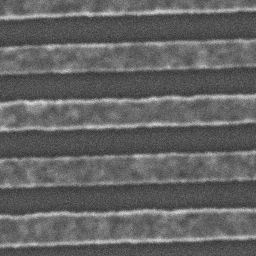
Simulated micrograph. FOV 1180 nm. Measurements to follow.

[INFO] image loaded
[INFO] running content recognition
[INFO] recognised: lines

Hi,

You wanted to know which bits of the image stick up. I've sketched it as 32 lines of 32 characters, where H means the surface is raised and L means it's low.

HHHHHHHHHHHHHHHHHHHHHHHHHHHHHHHH
HHHHHHHHHHHHHHHHHHHHLHLLLLLLLLLL
LLLLLLLLLLLLLLLLLLLLLLLLLLLLLLLL
LLLLLLLLLLLLLLLLLLLLLLLLLLLLLLLL
LLLLLLLLLLLLLLLLLLLLLLLLLLLLLLLL
LLLLLLLLLLLLLLLHHHHHHHHHHHHHHHHH
HHHHHHHHHHHHHHHHHHHHHHHHHHHHHHHH
HHHHHHHHHHHHHHHHHHHHHHHHHHHHHHHH
HHHHHHHHHHHHHHHHHHHHHHHHLLLLLLLL
LLLLLLLLLLLLLLLLLLLLLLLLLLLLLLLL
LLLLLLLLLLLLLLLLLLLLLLLLLLLLLLLL
LLLLLLLLLLLLLLLLLLLLLLLLLLLLLLLL
LLLLLLLLLLLLLHHHHLHHHHHHHHHHHHHH
HHHHHHHHHHHHHHHHHHHHHHHHHHHHHHHH
HHHHHHHHHHHHHHHHHHHHHHHHHHHHHHHH
HHHHHHHHHHHHHHHHHHHHHHHHHHHLLLLL
LLLLLLLLLLLLLLLLLLLLLLLLLLLLLLLL
LLLLLLLLLLLLLLLLLLLLLLLLLLLLLLLL
LLLLLLLLLLLLLLLLLLLLLLLLLLLLLLLL
LLLLLLLLLLLLLLLLHHHHHHHHHHHHHHHH
HHHHHHHHHHHHHHHHHHHHHHHHHHHHHHHH
HHHHHHHHHHHHHHHHHHHHHHHHHHHHHHHH
HHHHHHHHHHHHHHHHHHHHHHHHHHHHHLHL
LLLLLLLLLLLLLLLLLLLLLLLLLLLLLLLL
LLLLLLLLLLLLLLLLLLLLLLLLLLLLLLLL
LLLLLLLLLLLLLLLLLLLLLLLLLLLLLLLL
LLLLLLLLLLLLLLLLLHHHHLHHHHHHHHHH
HHHHHHHHHHHHHHHHHHHHHHHHHHHHHHHH
HHHHHHHHHHHHHHHHHHHHHHHHHHHHHHHH
HHHHHHHHHHHHHHHHHHHHHHHHHHHHHHHH
HHHHHHHHHHLLLLLLLLLLLLLLLLLLLLLL
LLLLLLLLLLLLLLLLLLLLLLLLLLLLLLLL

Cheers